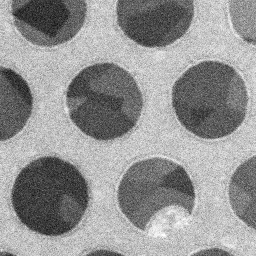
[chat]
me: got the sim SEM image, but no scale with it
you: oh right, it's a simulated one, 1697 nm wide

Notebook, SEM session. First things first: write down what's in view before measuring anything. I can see raised bodies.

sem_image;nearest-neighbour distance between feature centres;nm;683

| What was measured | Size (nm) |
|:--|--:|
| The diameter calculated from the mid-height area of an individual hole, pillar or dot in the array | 530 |